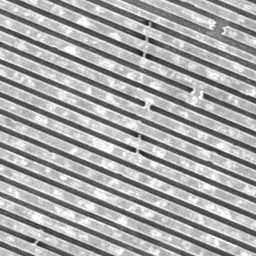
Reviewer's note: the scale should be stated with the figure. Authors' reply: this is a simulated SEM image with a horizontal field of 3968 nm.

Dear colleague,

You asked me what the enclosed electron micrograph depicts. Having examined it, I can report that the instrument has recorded parallel lines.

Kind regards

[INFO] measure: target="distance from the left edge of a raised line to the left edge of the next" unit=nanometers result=237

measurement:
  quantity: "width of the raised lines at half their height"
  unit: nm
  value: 149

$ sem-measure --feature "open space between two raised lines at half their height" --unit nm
89.5